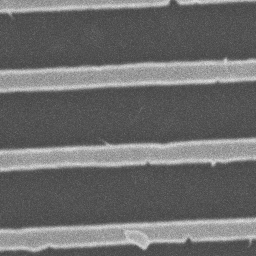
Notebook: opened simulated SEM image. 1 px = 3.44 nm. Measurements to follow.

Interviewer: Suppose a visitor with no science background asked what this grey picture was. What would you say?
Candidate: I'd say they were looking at one or a few lines or trenches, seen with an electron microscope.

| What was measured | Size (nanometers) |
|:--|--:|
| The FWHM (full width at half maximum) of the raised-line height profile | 65.7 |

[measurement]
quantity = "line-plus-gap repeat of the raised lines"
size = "273 nm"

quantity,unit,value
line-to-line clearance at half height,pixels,60